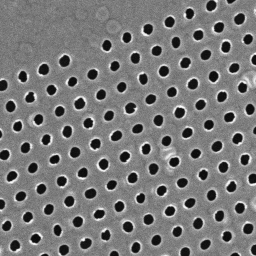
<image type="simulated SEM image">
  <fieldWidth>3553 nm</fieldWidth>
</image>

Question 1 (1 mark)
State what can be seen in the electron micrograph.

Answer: a regular array of holes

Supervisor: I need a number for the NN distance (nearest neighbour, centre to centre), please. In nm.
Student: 302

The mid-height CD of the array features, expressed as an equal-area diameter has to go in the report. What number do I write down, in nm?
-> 146